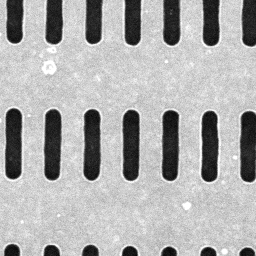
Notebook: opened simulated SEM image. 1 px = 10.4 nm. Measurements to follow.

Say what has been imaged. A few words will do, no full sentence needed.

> holes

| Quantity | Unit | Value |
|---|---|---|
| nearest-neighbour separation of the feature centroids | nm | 407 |